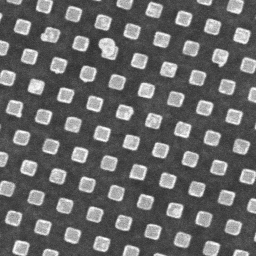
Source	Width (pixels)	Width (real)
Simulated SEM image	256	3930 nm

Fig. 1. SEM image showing a regular array of raised bodies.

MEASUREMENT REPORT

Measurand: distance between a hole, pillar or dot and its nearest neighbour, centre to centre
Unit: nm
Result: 464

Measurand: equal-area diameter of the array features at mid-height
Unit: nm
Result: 241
